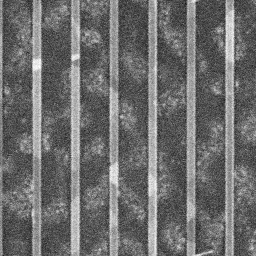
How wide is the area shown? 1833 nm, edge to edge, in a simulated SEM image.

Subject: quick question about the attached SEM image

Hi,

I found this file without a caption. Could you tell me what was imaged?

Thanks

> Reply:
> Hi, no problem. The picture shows parallel lines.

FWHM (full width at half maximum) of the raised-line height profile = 50.1 nanometers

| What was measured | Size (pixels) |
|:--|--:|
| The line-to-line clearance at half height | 31.5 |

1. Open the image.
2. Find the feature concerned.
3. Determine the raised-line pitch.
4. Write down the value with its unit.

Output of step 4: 276 nm